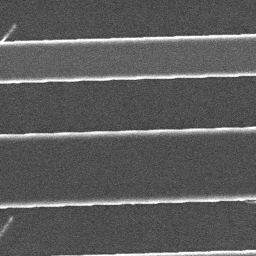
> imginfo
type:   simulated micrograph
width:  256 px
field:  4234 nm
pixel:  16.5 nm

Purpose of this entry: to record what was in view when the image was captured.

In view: lines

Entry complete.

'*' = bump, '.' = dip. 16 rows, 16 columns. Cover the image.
................
................
.....***********
****************
****************
................
................
................
****************
****************
****************
****************
****************
................
................
................